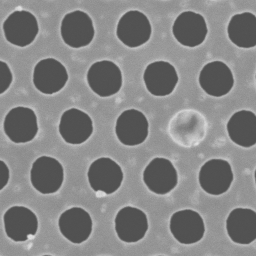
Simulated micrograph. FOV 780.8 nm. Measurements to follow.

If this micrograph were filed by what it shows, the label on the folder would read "a regular array of holes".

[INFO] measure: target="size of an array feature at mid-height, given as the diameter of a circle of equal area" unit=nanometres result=106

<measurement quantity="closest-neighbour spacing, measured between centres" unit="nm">169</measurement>